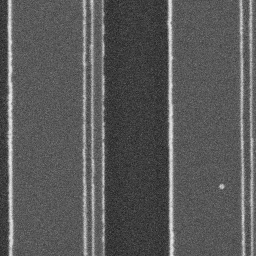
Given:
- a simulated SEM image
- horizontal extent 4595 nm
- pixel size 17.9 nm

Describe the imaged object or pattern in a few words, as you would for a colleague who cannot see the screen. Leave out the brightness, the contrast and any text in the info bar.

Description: lines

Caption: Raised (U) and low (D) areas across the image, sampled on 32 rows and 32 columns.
DUUUUUUUUUUUUDDDDDDDDUUUUUUUUUUU
DUUUUUUUUUUUUDDDDDDDDUUUUUUUUUUU
DUUUUUUUUUUUUDDDDDDDDUUUUUUUUUUU
DUUUUUUUUUUUUDDDDDDDDUUUUUUUUUUU
DUUUUUUUUUUUUDDDDDDDDUUUUUUUUUUU
DUUUUUUUUUUUUDDDDDDDDUUUUUUUUUUU
DUUUUUUUUUUUUDDDDDDDDUUUUUUUUUUU
DUUUUUUUUUUUUDDDDDDDDUUUUUUUUUUU
DUUUUUUUUUUUUDDDDDDDDUUUUUUUUUUU
DUUUUUUUUUUUUDDDDDDDDUUUUUUUUUUU
DUUUUUUUUUUUUDDDDDDDDUUUUUUUUUUU
DUUUUUUUUUUUUDDDDDDDDUUUUUUUUUUU
DUUUUUUUUUUUUDDDDDDDDUUUUUUUUUUU
DUUUUUUUUUUUUDDDDDDDDUUUUUUUUUUU
DUUUUUUUUUUUUDDDDDDDDUUUUUUUUUUU
DUUUUUUUUUUUUDDDDDDDDUUUUUUUUUUU
DUUUUUUUUUUUUDDDDDDDDUUUUUUUUUUU
DUUUUUUUUUUUUDDDDDDDDUUUUUUUUUUU
DUUUUUUUUUUUUDDDDDDDDUUUUUUUUUUU
DUUUUUUUUUUUUDDDDDDDDDUUUUUUUUUU
DUUUUUUUUUUUUDDDDDDDDDUUUUUUUUUU
DUUUUUUUUUUUUDDDDDDDDDUUUUUUUUUU
DUUUUUUUUUUUUDDDDDDDDDUUUUUUUUUU
DUUUUUUUUUUUUDDDDDDDDDUUUUUUUUUU
DUUUUUUUUUUUUDDDDDDDDUUUUUUUUUUU
DUUUUUUUUUUUUDDDDDDDDDUUUUUUUUUU
DUUUUUUUUUUUUDDDDDDDDDUUUUUUUUUU
DUUUUUUUUUUUUDDDDDDDDDUUUUUUUUUU
DUUUUUUUUUUUUDDDDDDDDDUUUUUUUUUU
DUUUUUUUUUUUUDDDDDDDDDUUUUUUUUUU
DUUUUUUUUUUUUDDDDDDDDDUUUUUUUUUU
DUUUUUUUUUUUUDDDDDDDDDUUUUUUUUUU